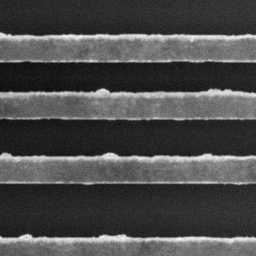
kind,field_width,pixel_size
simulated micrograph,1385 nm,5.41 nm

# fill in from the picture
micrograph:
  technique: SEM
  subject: lines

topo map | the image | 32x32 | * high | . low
................................
................................
................................
................................
..*..************************.**
********************************
********************************
********************************
................................
................................
................................
................................
********************************
********************************
********************************
................................
................................
................................
................................
................................
********************************
********************************
********************************
................................
................................
................................
................................
................................
................................
................................
********************************
********************************